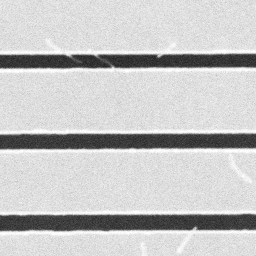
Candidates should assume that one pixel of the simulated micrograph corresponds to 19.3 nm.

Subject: lines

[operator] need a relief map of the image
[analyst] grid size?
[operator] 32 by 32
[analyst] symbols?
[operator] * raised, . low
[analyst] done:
********************************
********************************
********************************
********************************
********************************
********************************
********************************
................................
................................
********************************
********************************
********************************
********************************
********************************
********************************
********************************
********************************
................................
................................
********************************
********************************
********************************
********************************
********************************
********************************
********************************
********************************
................................
................................
********************************
********************************
********************************